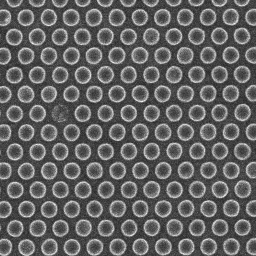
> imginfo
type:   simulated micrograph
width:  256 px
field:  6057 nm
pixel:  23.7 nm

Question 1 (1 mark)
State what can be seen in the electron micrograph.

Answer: a regular array of raised bodies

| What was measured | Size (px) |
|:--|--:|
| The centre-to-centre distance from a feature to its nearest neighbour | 22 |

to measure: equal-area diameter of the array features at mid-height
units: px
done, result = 16.3